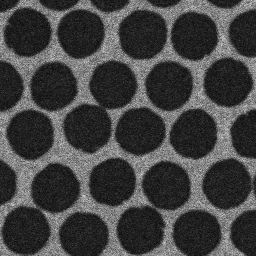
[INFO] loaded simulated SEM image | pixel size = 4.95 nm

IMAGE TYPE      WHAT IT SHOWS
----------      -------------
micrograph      a regular array of holes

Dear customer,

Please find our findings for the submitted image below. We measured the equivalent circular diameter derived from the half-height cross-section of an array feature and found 242 nm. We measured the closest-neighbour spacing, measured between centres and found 264 nm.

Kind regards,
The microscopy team